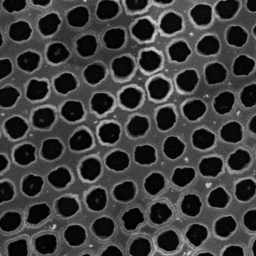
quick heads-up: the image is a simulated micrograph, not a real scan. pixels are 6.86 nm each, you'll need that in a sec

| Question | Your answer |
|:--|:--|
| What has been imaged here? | a regular array of holes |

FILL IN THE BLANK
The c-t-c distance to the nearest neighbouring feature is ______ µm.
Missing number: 0.197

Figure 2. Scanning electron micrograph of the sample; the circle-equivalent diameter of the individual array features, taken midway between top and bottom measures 146 nm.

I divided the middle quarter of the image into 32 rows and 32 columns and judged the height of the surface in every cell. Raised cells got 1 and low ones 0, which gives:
11111100001100000010000011111111
11111000001100000111000111111110
00111000001100001111111111111000
00011000001111111111111011110000
00011100011111111111110000110000
00011111111111111111100000010000
00111111111111100001100000111000
11111111000111000000100000111111
11111110000011000001110001111111
10001110000011000001111111111110
00001110000011100011111111111100
00000110000111111111111100011100
00000111111111111111111000001100
00001111111111111000011000001110
11111111111111110000011000001111
11111111110000110000011000011111
11111111100000110000011101111111
11100011100000110000111111111111
11000001100000111111111111001111
10000001110001111111111110000111
10000001111111111110001110000011
11001111111111111100000110000011
11111111111100001100000110000111
11111111111000001100000111001111
11111000010000001100001111111111
11110000011000001111111111111111
01110000011110011111111111110000
01110000011111111111110011100000
00111000111111111111100001100000
01111111111111100111000001100000
11111111111110000011000001111011
11111110001110000011000011111111